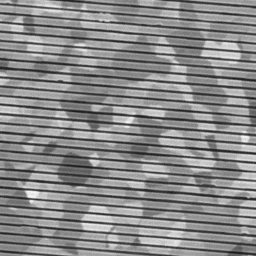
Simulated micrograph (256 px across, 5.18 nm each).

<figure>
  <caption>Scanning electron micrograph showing parallel lines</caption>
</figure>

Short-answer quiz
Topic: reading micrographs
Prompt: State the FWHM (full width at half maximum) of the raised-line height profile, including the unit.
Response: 32.2 nanometres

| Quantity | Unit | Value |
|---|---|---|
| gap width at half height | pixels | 3.47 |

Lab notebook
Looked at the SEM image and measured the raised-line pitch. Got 47.2 nm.